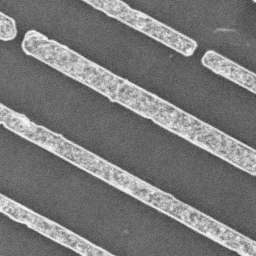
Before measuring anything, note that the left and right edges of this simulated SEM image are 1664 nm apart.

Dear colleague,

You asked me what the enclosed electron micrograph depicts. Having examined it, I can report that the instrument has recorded one or a few lines or trenches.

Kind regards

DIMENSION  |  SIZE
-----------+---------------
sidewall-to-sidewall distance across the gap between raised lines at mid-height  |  379 nm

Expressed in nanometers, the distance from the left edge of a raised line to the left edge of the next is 492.